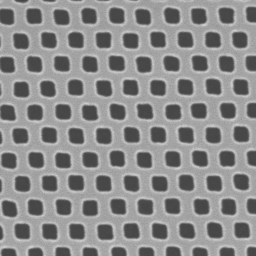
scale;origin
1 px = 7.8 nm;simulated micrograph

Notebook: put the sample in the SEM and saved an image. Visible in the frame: a regular array of holes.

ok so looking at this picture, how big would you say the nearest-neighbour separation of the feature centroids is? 208 nm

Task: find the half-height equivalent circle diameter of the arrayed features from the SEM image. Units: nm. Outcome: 132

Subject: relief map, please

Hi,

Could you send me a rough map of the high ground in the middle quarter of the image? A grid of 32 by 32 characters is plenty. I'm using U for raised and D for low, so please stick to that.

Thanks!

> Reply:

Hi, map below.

DUUUUDDDUUUDDDDUUUDDDDUUUDDDDUUU
DUUUUDDDUUUUDDDUUUDDDDUUUDDDDUUU
UUUUUUUUUUUUUUUUUUUUUUUUUUUUUUUU
UUUUUUUUUUUUUUUUUUUUUUUUUUUUUUUU
UDDDDUUUDDDDUUUDDDUUUUDDDUUUDDDD
UDDDDUUUDDDDUUUDDDDUUUDDDUUUDDDD
UDDDDUUUDDDDUUUDDDDUUUDDDUUUDDDD
UDDDDUUUDDDDUUUDDDUUUUDDDUUUUDDD
UUUUUUUUUUUUUUUUUUUUUUUUUUUUUUUU
UUUUUUUUUUUUUUUUUUUUUUUUUUUUUUUU
DUUUUDDDUUUDDDDUUUDDDDUUUUDDDUUU
DDUUDDDDUUUDDDDUUUDDDDUUUDDDDUUU
DDUUDDDDUUUDDDDUUUDDDDUUUDDDDUUU
DUUUUDDDUUUUDDDUUUUDDDUUUUDDDUUU
UUUUUUUUUUUUUUUUUUUUUUUUUUUUUUUU
UUUUUUUUUUUUUUUUUUUUUUUUUUUUUUUU
UDDDDUUUDDDUUUUDDDUUUUDDDUUUDDDD
UDDDDUUUDDDDUUUDDDDUUDDDDUUUDDDD
UDDDDUUUDDDDUUUDDDDUUUDDDUUUUDDD
UUDDDUUUDDDDUUUUDDUUUUDDDUUUUDDD
UUUUUUUUUUUUUUUUUUUUUUUUUUUUUUUU
UUUUUUUUUUUUUUUUUUUUUUUUUUUUUUUU
DUUUUDDDUUUDDDDUUUDDDUUUUDDDDUUU
DDUUDDDDDUUDDDDUUUDDDDUUUDDDDUUU
DDUUDDDDDUUDDDDUUUDDDDUUUDDDDUUU
DDUUUDDDUUUUDDDUUUDDDDUUUUDDDUUU
UUUUUUUUUUUUUUUUUUUUUUUUUUUUUUUU
UUUUUUUUUUUUUUUUUUUUUUUUUUUUUUUU
UDDDDUUUDDDDUUUDDDDUUUDDDDUUUDDD
UDDDDUUUDDDDUUUDDDDUUUDDDDUUDDDD
UDDDDUUUDDDDUUUDDDDUUUDDDDUUUDDD
UUDDDUUUDDDDUUUUDDDUUUUDDDUUUDDD